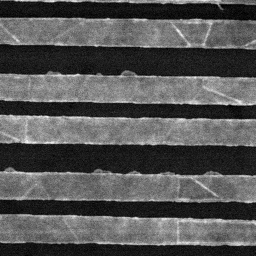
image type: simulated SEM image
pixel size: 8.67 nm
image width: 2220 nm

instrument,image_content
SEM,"lines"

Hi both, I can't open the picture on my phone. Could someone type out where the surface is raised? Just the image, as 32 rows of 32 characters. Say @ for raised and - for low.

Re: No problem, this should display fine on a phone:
---------------------------@--@@
--------------------------------
@@@@@@@@@@@@@@@@@@@----@@-------
@@@@@@@@@@@@@@@@@@@@@@@@@@@@@@@@
@@@@@@@@@@@@@@@@@@@@@@@@@@@@@@@@
-@@@@@@@@@@@@@@@@@@@@@@@@@@@@@@@
--------------------------------
--------------------------------
--------------------------------
@@@@@@@@@@@@---@@---------------
@@@@@@@@@@@@@@@@@@@@@@@@@@@@@@@@
@@@@@@@@@@@@@@@@@@@@@@@@@@@@@@@@
@@@@@@@@@@@@@@@@@@@@@@@@@@@@@@@@
--------------------------------
@@------------------------------
@@@@@@@@@@@@@@@@@@@@@@@@@@@@@@@@
@@@@@@@@@@@@@@@@@@@@@@@@@@@@@@@@
@@@@@@@@@@@@@@@@@@@@@@@@@@@@@@@@
--------------------------------
--------------------------------
--------------------------------
@@------------------------------
@@@@@@@@@@@@@@@@@@@@@@@@@@@@@@@@
@@@@@@@@@@@@@@@@@@@@@@@@@@@@@@@@
@@@@@@@@@@@@@@@@@@@@@@@@@@@@@@@@
--------------------------------
--------------------------------
@@@@@@@@@@@@@@@@@@@@@@@@@@@@----
@@@@@@@@@@@@@@@@@@@@@@@@@@@@@@@@
@@@@@@@@@@@@@@@@@@@@@@@@@@@@@@@@
---------------@@@@@@@@@@@@@@@@@
--------------------------------